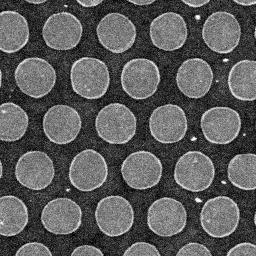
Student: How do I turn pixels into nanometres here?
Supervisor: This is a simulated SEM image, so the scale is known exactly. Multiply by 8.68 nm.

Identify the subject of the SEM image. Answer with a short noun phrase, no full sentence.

a regular array of raised bodies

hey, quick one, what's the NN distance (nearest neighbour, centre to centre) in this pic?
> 454 nanometres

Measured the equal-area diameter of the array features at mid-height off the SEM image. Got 335 nm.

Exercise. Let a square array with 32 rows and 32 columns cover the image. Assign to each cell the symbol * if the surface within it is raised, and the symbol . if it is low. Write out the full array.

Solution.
..........**.....**.....*.....**
.*..............................
***...****...***...****...****..
****.*****..*****..****..*****..
****.*****..*****..****..*****..
***...****...****..****...****..
..............*............*....
...**.....**.....*......*.......
..*****..****...****...***...***
..*****..*****.*****..*****..***
..*****..*****.*****..****...***
...***....***...***....***...***
................................
***...***....***....**.....**...
***...****..*****..****..*****..
***..*****..*****..****..*****..
***...****..*****..****..*****..
**....***....***....**....***...
................................
...***....***...***....***....**
..*****..****..*****..*****..***
..*****..****..*****..*****..***
..****...****...****..*****..***
....*.....**.....*.....***....**
................................
***...****..****...****...***...
***..*****..*****..****..*****..
***..*****..*****..****..*****..
***...****..****...****..****...
....................*......*....
...**............**.....*.......
..****...****...****..****...***